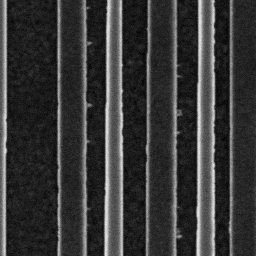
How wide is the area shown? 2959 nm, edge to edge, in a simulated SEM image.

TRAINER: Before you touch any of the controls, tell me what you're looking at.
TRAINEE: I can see lines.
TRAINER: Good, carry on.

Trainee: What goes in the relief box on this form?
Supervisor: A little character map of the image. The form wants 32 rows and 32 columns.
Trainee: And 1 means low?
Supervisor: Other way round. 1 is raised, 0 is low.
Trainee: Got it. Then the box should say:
10000001111001100001110001100111
10000001111001100001110001100111
10000001111001100001110001100111
10000001111001100001110001100111
10000001111001100001110001100111
10000001111001100001110001100111
10000001111001100001110001100111
10000001111001100011110001100111
10000001111001100011110001100111
10000001111001100011110001100111
10000001111001100011110001100111
10000001111001100011110001100111
10000001111001100011110001100111
10000001111001100011110001100111
10000001111001100011110001100111
10000001111001100011110001100111
10000001111001100011110001100111
10000001111001100011110001100111
10000001111001100011110001100111
10000001111001100011110001100111
10000001111001100011110001100111
10000001111001100011110001100111
10000001111001100011110001100111
10000001111001100011110001100111
10000001111001100011110001100111
10000001111001100011110001100111
10000001111001100011110001100111
10000001111001100011110001100111
10000001111001100011110001100111
10000001111001100011110001100111
10000001111001100011110001100111
10000001111001100011110001100111